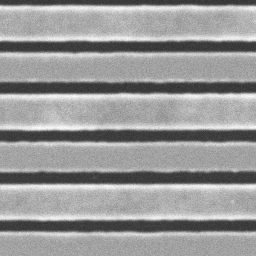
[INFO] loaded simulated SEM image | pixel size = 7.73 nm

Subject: lines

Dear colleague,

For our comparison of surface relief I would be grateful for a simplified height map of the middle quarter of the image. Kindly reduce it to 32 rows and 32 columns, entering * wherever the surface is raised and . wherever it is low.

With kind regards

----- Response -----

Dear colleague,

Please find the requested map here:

********************************
********************************
********************************
********************************
...........**..........**.......
................................
................................
.............****.*...****....**
********************************
********************************
********************************
********************************
********************************
********************************
********************************
********************************
................................
................................
................................
................................
********************************
********************************
********************************
********************************
********************************
********************************
********************************
................................
................................
................................
********************************
********************************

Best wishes